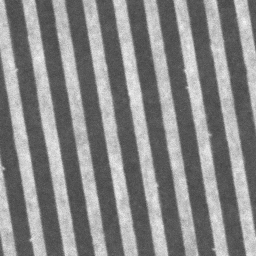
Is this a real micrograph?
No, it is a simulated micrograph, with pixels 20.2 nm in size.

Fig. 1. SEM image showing parallel lines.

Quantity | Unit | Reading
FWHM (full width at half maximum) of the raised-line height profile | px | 11.5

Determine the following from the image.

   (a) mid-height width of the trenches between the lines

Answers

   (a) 0.373 microns